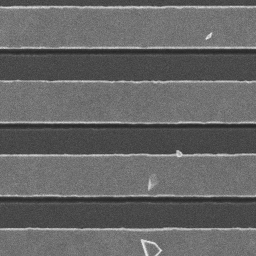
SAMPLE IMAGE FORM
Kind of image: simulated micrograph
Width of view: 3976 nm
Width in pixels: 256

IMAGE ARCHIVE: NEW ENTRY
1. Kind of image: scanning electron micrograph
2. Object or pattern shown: lines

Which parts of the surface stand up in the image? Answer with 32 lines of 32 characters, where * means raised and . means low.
................................
********************************
********************************
********************************
********************************
********************************
................................
................................
................................
................................
********************************
********************************
********************************
********************************
********************************
................................
................................
................................
................................
********************************
********************************
********************************
********************************
********************************
........****..*..........**..***
................................
................................
................................
...*................***......*..
********************************
********************************
********************************